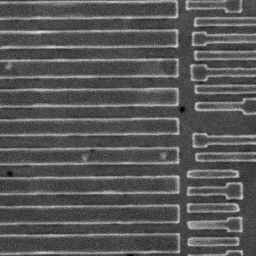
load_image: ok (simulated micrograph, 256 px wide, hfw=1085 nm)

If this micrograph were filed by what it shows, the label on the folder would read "wiring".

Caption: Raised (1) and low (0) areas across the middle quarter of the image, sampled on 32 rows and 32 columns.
11111111111111111111111111110000
11111111111111111111111111110000
11111111111111111111111111110000
00000000000000000000000000000000
00000000000000000000000000000000
00000000000000000000000000000000
11111111111111111111111111110000
11111111111111111111111111110000
11111111111111111111111111110000
11111111111111111111111111110000
11111111111111111000110000000000
00000000000000000000000000000000
00000000000000000000000000000000
00000000000000000000000111000000
11111111111111111111111111110000
11111111111111111111111111111000
11111111111111111111111111111000
11111111111111111111111111110000
00000000000000000000000000000000
00000000000000000000000000000000
00000000000000000000000000000000
11111111111111111111111111111000
11111111111111111111111111111000
11111111111111111111111111111000
11111111111111101111111111111000
00000000000000000000000000000000
00000000000000000000000000000000
00000000000000000000000000000001
11111111111111111111111111111000
11111111000001111111111111111000
11111110000001111111111111111000
11111100000001111111111111111001